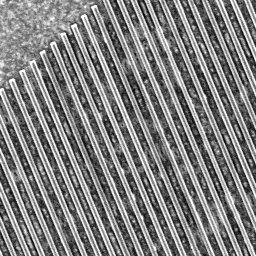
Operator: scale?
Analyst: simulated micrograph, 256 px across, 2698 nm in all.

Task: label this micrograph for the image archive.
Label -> parallel lines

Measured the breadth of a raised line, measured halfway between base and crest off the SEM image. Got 49.8 nm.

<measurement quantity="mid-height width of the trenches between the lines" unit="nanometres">91.2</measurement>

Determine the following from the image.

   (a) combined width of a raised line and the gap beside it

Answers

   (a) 138 nm